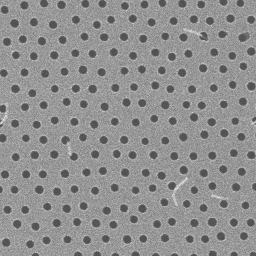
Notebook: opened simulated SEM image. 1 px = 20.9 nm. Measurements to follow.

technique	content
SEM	a regular array of holes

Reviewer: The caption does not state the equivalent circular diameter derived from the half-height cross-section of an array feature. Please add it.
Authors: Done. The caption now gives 170 nanometers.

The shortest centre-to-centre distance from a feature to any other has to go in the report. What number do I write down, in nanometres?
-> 354